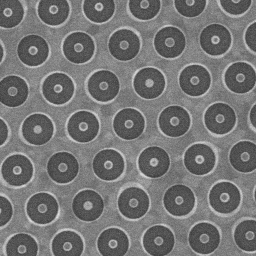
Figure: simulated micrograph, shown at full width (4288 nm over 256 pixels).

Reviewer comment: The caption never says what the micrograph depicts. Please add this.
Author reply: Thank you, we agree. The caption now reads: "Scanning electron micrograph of an array of small figures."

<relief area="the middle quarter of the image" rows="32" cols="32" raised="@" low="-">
@@@@@@@@@@@@@@@@@@@@@@@@@@@@@@@-
@@@@@@@@--@@@@@@@@@-----@@@@@---
-@@@@@@------@@@@@-------@@@@---
--@@@@--------@@@--------@@@@---
--@@@@--------@@@---------@@@---
---@@----@@---@@@--------@@@@---
---@@@--------@@@@-------@@@@---
--@@@@--------@@@@------@@@@@@@-
--@@@@@------@@@@@@@---@@@@@@@@@
-@@@@@@@---@@@@@@@@@@@@@@@@@@@@@
@@@@@@@@@@@@@@@@@@@@@@@@@@@--@@@
@@@@-@@@@@@@@@----@@@@@@@------@
@@------@@@@@-------@@@@-------@
@-------@@@@--------@@@@---@----
@--------@@@----@----@@----@@---
@---@@---@@@---@@---@@@@--------
---------@@@--------@@@@-------@
@--------@@@@------@@@@@@-----@@
@@------@@@@@@----@@@@@@@@@@@@@@
@@@---@@@@@@@@@@@@@@@@@@@@@@@@@@
@@@@@@@@@@@@@@@@@@@@@@-@@@@@@@@@
@@@@@@@@@@---@@@@@@@-----@@@@@@-
--@@@@@@------@@@@@-------@@@@--
---@@@@--------@@@@-------@@@@--
---@@@@--------@@@----@----@@@--
@---@@@---@@----@@--------@@@@--
----@@@--------@@@@-------@@@@@-
---@@@@@-------@@@@@-----@@@@@@@
---@@@@@@-----@@@@@@@@-@@@@@@@@@
--@@@@@@@@@@@@@@@@@@@@@@@@@@@@@@
@@@@@@@@@@@@@@@----@@@@@@@@----@
@@@@---@@@@@@@------@@@@@@------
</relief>